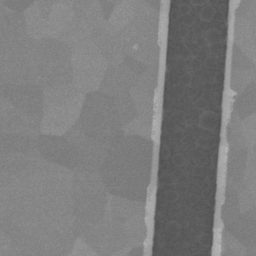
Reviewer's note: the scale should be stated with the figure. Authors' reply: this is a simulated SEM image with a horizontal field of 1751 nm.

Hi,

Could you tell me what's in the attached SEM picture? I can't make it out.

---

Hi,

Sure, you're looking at one or a few lines or trenches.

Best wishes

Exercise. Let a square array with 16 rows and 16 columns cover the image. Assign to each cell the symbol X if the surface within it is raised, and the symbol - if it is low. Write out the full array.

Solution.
XXXXXXXXXX----XX
XXXXXXXXXX----XX
XXXXXXXXXX----XX
XXXXXXXXXX----XX
XXXXXXXXXX----XX
XXXXXXXXXX----XX
XXXXXXXXXX----XX
XXXXXXXXXX----XX
XXXXXXXXXX----XX
XXXXXXXXXX----XX
XXXXXXXXXX----XX
XXXXXXXXXX----XX
XXXXXXXXXX----XX
XXXXXXXXX-----XX
XXXXXXXXX----XXX
XXXXXXXXX----XXX